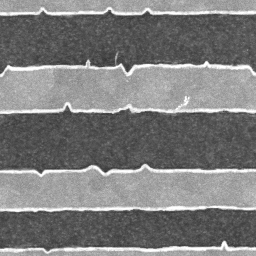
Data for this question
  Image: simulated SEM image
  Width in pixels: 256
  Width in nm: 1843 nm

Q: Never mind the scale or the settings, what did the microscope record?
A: one or a few lines or trenches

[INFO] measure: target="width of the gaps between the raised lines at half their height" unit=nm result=386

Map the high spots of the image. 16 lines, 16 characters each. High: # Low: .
################
................
................
................
################
################
################
................
................
................
................
################
################
................
................
.....##......#..